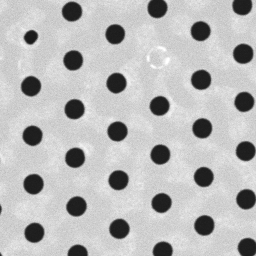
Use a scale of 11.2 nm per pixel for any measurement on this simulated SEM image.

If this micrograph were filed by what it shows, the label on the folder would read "a regular array of holes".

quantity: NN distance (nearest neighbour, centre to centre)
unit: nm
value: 544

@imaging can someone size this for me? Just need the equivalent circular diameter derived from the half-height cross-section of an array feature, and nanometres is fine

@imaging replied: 228